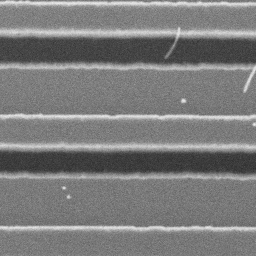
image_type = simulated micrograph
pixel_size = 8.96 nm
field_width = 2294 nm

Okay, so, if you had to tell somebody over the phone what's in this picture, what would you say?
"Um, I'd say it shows lines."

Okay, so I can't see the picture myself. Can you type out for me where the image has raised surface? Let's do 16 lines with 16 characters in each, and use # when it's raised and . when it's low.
################
################
................
................
################
################
################
################
################
................
................
################
################
################
################
################